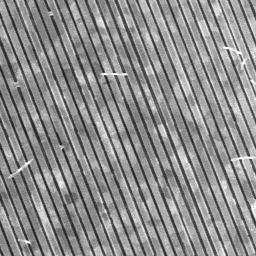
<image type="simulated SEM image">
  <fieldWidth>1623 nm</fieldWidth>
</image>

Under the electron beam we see parallel lines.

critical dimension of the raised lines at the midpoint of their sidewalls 0.042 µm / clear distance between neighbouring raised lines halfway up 20.6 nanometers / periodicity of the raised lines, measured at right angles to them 60.1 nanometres